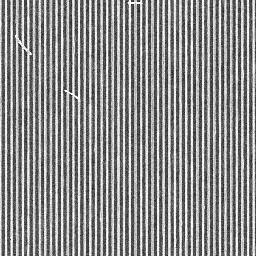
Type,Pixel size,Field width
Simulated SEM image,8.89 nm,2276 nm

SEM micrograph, parallel lines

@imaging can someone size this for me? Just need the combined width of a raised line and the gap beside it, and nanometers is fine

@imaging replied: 50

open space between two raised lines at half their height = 32.2 nm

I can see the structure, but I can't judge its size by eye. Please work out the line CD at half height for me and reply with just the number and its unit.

18.9 nm